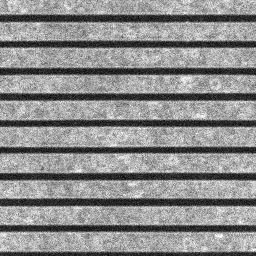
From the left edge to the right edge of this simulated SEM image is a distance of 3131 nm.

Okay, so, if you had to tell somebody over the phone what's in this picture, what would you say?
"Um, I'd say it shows parallel lines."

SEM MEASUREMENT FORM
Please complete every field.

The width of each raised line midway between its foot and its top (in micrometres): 0.225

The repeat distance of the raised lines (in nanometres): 322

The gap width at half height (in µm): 0.0963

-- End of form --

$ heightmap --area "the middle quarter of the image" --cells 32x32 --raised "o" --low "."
oooooooooooooooooooooooooooooooo
................................
................................
oooooooooooooooooooooooooooooooo
oooooooooooooooooooooooooooooooo
oooooooooooooooooooooooooooooooo
oooooooooooooooooooooooooooooooo
................................
................................
oooooooooooooooooooooooooooooooo
oooooooooooooooooooooooooooooooo
oooooooooooooooooooooooooooooooo
oooooooooooooooooooooooooooooooo
oooooooooooooooooooooooooooooooo
................................
................................
oooooooooooooooooooooooooooooooo
oooooooooooooooooooooooooooooooo
oooooooooooooooooooooooooooooooo
oooooooooooooooooooooooooooooooo
................................
................................
oo......oooooooooooooooooooooooo
oooooooooooooooooooooooooooooooo
oooooooooooooooooooooooooooooooo
oooooooooooooooooooooooooooooooo
oooooooooooooooooooooooooooooooo
................................
................................
oooooooooooooooooooooooooooooooo
oooooooooooooooooooooooooooooooo
oooooooooooooooooooooooooooooooo